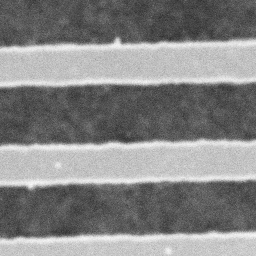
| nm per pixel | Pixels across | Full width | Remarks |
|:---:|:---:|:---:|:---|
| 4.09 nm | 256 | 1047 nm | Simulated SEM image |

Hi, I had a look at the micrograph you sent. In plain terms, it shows lines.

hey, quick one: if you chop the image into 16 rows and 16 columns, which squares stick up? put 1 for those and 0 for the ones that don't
0000000000000000
0000000000000000
0000000000000000
1111111111111111
1111111111111111
0000000000000000
0000000000000000
0000000000000000
0000000000000000
1111111111111111
1111111111111111
1111000000000000
0000000000000000
0000000000000000
0000000000000000
1111111111111111